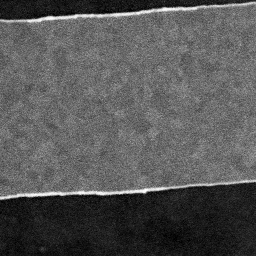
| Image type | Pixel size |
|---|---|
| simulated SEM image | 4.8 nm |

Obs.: one or a few lines or trenches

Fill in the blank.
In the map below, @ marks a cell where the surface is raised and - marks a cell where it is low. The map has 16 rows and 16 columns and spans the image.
-----------@@@@@
@@@@@@@@@@@@@@@@
@@@@@@@@@@@@@@@@
@@@@@@@@@@@@@@@@
@@@@@@@@@@@@@@@@
@@@@@@@@@@@@@@@@
@@@@@@@@@@@@@@@@
@@@@@@@@@@@@@@@@
@@@@@@@@@@@@@@@@
@@@@@@@@@@@@@@@@
@@@@@@@@@@@@@@@@
@@@@@@@@@@@@@@--
----------------
----------------
----------------
----------------